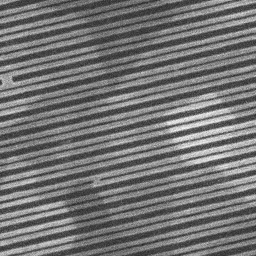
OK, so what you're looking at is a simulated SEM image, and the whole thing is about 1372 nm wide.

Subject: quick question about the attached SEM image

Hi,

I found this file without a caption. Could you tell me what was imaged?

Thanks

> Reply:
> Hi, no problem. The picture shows parallel lines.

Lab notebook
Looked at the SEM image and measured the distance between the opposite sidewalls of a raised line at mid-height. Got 19.6 nanometres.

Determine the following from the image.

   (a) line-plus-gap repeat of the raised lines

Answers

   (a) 9.01 px